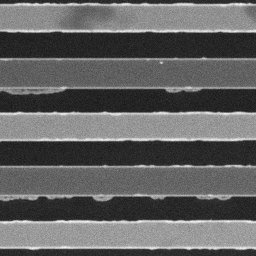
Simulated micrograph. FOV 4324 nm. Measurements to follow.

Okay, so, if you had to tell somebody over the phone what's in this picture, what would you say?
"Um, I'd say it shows lines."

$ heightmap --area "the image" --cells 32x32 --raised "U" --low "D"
DDUUUUUDUUUUUDUUUUUDDDUUUDDDUUUU
UUUUUUUUUUUUUUUUUUUUUUUUUUUUUUUU
UUUUUUUUUUUUUUUUUUUUUUUUUUUUUUUU
UUUUUUUUUUUUUUUUUUUUUUUUUUUUUUUU
DDDDDDDDDDDDDDDDDDDDDDDDDDDDDDDD
DDDDDDDDDDDDDDDDDDDDDDDDDDDDDDDD
DDDDDDDDDDDDDDDDDDDDDDDDDDDDDDDD
UUUUUUUUUUUUUUUUUUUUUUUUUUUUUUUU
UUUUUUUUUUUUUUUUUUUUUUUUUUUUUUUU
UUUUUUUUUUUUUUUUUUUUUUUUUUUUUUUU
UUUUUUUUUUUUUUUUUUUUUUUUUUUUUUUU
DDDDDDDDDDDDDDDDDDDDDDDDDDDDDDDD
DDDDDDDDDDDDDDDDDDDDDDDDDDDDDDDD
DDDDDDDDDDDDDDDDDDDDDDDDDDDDDDDD
UUUUUUUUUUUUUUUUUUUUUUUUUUUUUUUU
UUUUUUUUUUUUUUUUUUUUUUUUUUUUUUUU
UUUUUUUUUUUUUUUUUUUUUUUUUUUUUUUU
UUUUUUUUUUUUUUUUUUUDUUUUUUUUUUDD
DDDDDDDDDDDDDDDDDDDDDDDDDDDDDDDD
DDDDDDDDDDDDDDDDDDDDDDDDDDDDDDDD
DDDDDDDDDDDDDDDDDDDDDDDDDDDDDDDD
UUUUUUUUUUUUUUUUUUUUUUUUUUUUUUUU
UUUUUUUUUUUUUUUUUUUUUUUUUUUUUUUU
UUUUUUUUUUUUUUUUUUUUUUUUUUUUUUUU
DDDDDDDDDDDDDDDDDDDDDDDDDDDDDDDD
DDDDDDDDDDDDDDDDDDDDDDDDDDDDDDDD
DDDDDDDDDDDDDDDDDDDDDDDDDDDDDDDD
DDDDDDDDDDDDDDDDDDDDDDDDDDDDDDDD
UUUUUUUUUUUUUUUUUUUUUUUUUUUUUUUU
UUUUUUUUUUUUUUUUUUUUUUUUUUUUUUUU
UUUUUUUUUUUUUUUUUUUUUUUUUUUUUUUU
DDDDDDDDDDDDDDDDDDDDDDDDDDDDDDDD